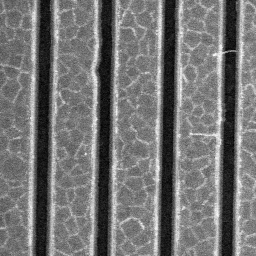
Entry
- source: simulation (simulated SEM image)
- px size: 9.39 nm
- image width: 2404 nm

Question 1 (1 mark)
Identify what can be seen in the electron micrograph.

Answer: one or a few lines or trenches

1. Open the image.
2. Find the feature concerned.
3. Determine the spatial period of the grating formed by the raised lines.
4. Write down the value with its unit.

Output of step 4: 584 nm